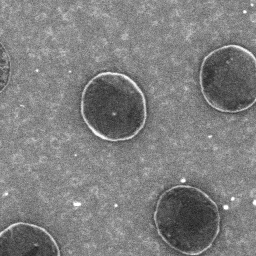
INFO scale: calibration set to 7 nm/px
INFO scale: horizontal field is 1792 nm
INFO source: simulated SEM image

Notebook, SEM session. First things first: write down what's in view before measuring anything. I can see raised bodies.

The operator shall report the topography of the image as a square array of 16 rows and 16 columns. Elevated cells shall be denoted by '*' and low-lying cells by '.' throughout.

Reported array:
................
................
................
.............***
.............***
.....****....***
.....****....***
.....****.......
......**........
................
................
................
..........***...
..........****..
***.......****..
****.......**...